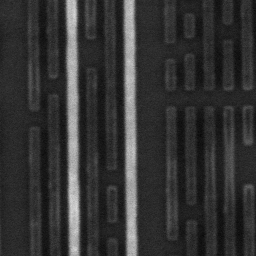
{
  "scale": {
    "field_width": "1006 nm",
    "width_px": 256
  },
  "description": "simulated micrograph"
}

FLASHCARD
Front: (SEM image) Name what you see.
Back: groups of lines, slits or small figures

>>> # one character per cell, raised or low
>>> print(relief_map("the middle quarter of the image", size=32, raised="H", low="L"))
LHHLLLLLLLLHLLLHHLLLLLLLLLHHLLHH
LHHLLLHHLLLHLLLHHLLLLLLLLLHHLLHH
LHHLLLHHLLLHLLLHHLLLLLLLLLHHLLLH
LHHLLLHHLLLHLLLHHLLLLLLLLLHHLLLH
LHHLLLHHLLLHLLLHHLLLLLLLLLHHLLLH
LHHLLLHHLLLHLLLHHLLLLLLLLLHHLLLH
LHHLLLHHLLLHLLLHHLLLLLLLLLLLLLLL
LHHLLLHHLLLHHLLHHLLLLLLLLLLLLLLL
LHHLLLHHLLLHHLLHHLLLLLLLLLLLLLLL
LHHLLLHHLLLHHLLHHLLLLLLLLLLLLLLL
LHHLLLHHLLLHHLLHHLLLLLLLLLLLLLLL
LHHLLLHHLLLHHLLHHHLLLLLLLLHHLLLH
LHHLLLHHLLLHHLLHHHLLLLLLLLHHLLLH
LHHLLLHHLLLHHLLHHHLLLLLLLLHHLLLH
LHHLLLHHLLLHHLLLHHLLLLLLLLHHLLLH
LHHLLLHHLLLHHLLLHHLLLLLLLLHHLLLH
LHHLLLHHLLLHHLLLHHLLLLLLLLHHLLLH
LHHLLLHHLLLHHLLLHHLLLLLLLLHHLLLH
LHHLLLHHLLLHHLLLHHLLLLLLLLHHLLLH
LHHLLLHHLLLHHLLLHHLLLLLLLLHHLLLH
LHHLLLHHLLLHHLLLHHLLLLLLLLHHLLLH
LHHLLLHHLLLHHLLLHHLLLLLLLLHHLLLH
LHHLLLHHLLLHHLLLHHLLLLLLLLHHLLLH
LHHLLLHHLLLHHLLLHHLLLLLLLLHHLLLH
LHHLLLHHLLLHHLLLHHLLLLLLLLHHLLLH
LHHLLLHHLLLHHLLLHHLLLLLLLLHHLLLH
LHHLLLHHLLLLLLLLHHLLLLLLLLHHLLLH
LHHLLLHHLLLLLLLLHHLLLLLLLLHHLLLH
LHHLLLHHLLLLLLLLHHLLLLLLLLHHLLLH
LHHLLLHHLLLLLLLLHHLLLLLLLLHHLLLH
LHHLLLHHLLLLLLLLHHLLLLLLLLHHLLLH
LHHLLLHHLLLHHLLLHHLLLLLLLLHHLLLH